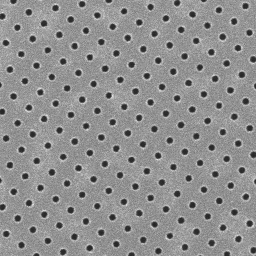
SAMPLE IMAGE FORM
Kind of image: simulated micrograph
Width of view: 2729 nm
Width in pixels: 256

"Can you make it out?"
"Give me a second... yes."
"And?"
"a regular array of holes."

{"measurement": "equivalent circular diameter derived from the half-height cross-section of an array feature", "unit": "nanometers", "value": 72.2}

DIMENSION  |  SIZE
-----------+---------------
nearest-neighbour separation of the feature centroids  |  201 nm